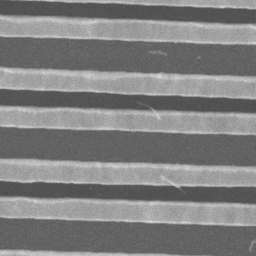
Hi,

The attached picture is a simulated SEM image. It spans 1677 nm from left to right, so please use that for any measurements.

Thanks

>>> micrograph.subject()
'lines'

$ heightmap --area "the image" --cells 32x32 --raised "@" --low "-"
-----------------@@@@@@@@@@@@@@@
--------------------------------
@@@@@@@@@@@@@@@@@@--------------
@@@@@@@@@@@@@@@@@@@@@@@@@@@@@@@@
@@@@@@@@@@@@@@@@@@@@@@@@@@@@@@@@
---------------------------@@-@@
--------------------------------
--------------------------------
@-------------------------------
@@@@@@@@@@@@@@@@@@@@@@@@@@@@@---
@@@@@@@@@@@@@@@@@@@@@@@@@@@@@@@@
-----------@@@@@@@@@@@@@@@@@@@@@
--------------------------------
@@@@@@@@@-----------------------
@@@@@@@@@@@@@@@@@@@@@@@@@@@@@@@@
@@@@@@@@@@@@@@@@@@@@@@@@@@@@@@@@
--------------------@@@@@@@@@@@@
--------------------------------
--------------------------------
--------------------------------
@@@@@@@@@@@@@@@@@@--------------
@@@@@@@@@@@@@@@@@@@@@@@@@@@@@@@@
@@@@@@@@@@@@@@@@@@@@@@@@@@@@@@@@
--------------------------------
--------------------------------
@@@@@@@@@@@@@@@@@@@@@@@@@@@@@@@-
@@@@@@@@@@@@@@@@@@@@@@@@@@@@@@@@
----------@@@@@@@@@@@@@@@@@@@@@@
--------------------------------
--------------------------------
--------------------------------
@@@@@@--------------------------